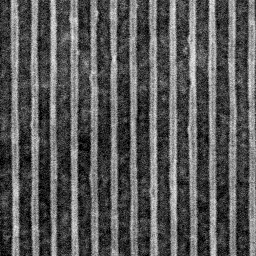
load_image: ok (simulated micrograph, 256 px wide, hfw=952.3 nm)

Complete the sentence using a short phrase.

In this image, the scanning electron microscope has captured parallel lines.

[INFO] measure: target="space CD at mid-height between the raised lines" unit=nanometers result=54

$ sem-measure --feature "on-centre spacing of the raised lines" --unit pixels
19.8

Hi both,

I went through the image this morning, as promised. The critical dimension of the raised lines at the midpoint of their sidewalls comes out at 19.1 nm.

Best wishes